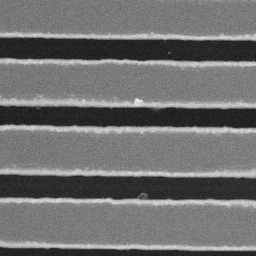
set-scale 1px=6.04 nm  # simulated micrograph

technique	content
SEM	lines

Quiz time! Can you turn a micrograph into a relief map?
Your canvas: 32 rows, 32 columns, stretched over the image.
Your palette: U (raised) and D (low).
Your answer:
UUUUUUUUUUUUUUUUUUUUUUUUUUUUUUUU
UUUUUUUUUUUUUUUUUUUUUUUUUUUUUUUU
UUUUUUUUUUUUUUUUUUUUUUUUUUUUUUUU
UUUUUUUUUUUUUUUUUUUUUUUUUUUUUUUU
UUUUUUUUUUUUUUUUUUUUUUUUUUUUUUUU
DDDDDDDDDDDDDDDDDDDDDDDDDDDDDDDD
DDDDDDDDDDDDDDDDDDDDDDDDDDDDDDDD
UUUUUUUUUUDDUUUUDDDDDDDDDDDDDDDD
UUUUUUUUUUUUUUUUUUUUUUUUUUUUUUUU
UUUUUUUUUUUUUUUUUUUUUUUUUUUUUUUU
UUUUUUUUUUUUUUUUUUUUUUUUUUUUUUUU
UUUUUUUUUUUUUUUUUUUUUUUUUUUUUUUU
UUUUUUUUUUUUUUUUUUUUUUUUUUUUUUUU
DDDDDDDDDDDDDDDDDDDDDDDDDDDDDDDD
DDDDDDDDDDDDDDDDDDDDDDDDDDDDDDDD
DDDDDDDDDDDDDDDDDDDDDDDDDDDDDDDD
UUUUUUUUUUUUUUUUUUUUUUUUUUUUUUUU
UUUUUUUUUUUUUUUUUUUUUUUUUUUUUUUU
UUUUUUUUUUUUUUUUUUUUUUUUUUUUUUUU
UUUUUUUUUUUUUUUUUUUUUUUUUUUUUUUU
UUUUUUUUUUUUUUUUUUUUUUUUUUUUUUUU
UUUUUUUUUUUUUUUUUUUUUUUUUUUUUUUU
DDDDDDDDDDDDDDDDDDDDDDDDDDDDDDDD
DDDDDDDDDDDDDDDDDDDDDDDDDDDDDDDD
DDDDDDDDDDDDDDDDDDDDDDDDDDDDDDDD
UUUUUUUUUUUUUUUUUUUUUUUUUUUUUUUU
UUUUUUUUUUUUUUUUUUUUUUUUUUUUUUUU
UUUUUUUUUUUUUUUUUUUUUUUUUUUUUUUU
UUUUUUUUUUUUUUUUUUUUUUUUUUUUUUUU
UUUUUUUUUUUUUUUUUUUUUUUUUUUUUUUU
UUUUUUUUUUUUUUUUUUUUUUUUUUUUUUUU
DDDDDDDDDDDDDDDDDDDDDDDDDDDDDDDD